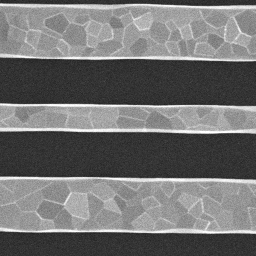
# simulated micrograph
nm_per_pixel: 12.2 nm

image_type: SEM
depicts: wiring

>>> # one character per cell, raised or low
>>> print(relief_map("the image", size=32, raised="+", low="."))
................................
++++++++++++++++++++++++++++++++
++++++++++++++++++++++++++++++++
++++++++++++++++++++++++++++++++
++++++++++++++++++++++++++++++++
++++++++++++++++++++++++++++++++
++++++++++++++++++++++++++++++++
................................
................................
................................
................................
................................
................................
++++++++++++++++++++++++++++++..
++++++++++++++++++++++++++++++++
++++++++++++++++++++++++++++++++
.........................+++....
................................
................................
................................
................................
................................
+++++++++++++++++..+++..........
++++++++++++++++++++++++++++++++
++++++++++++++++++++++++++++++++
++++++++++++++++++++++++++++++++
++++++++++++++++++++++++++++++++
++++++++++++++++++++++++++++++++
++++++++++++++++++++++++++++++++
................................
................................
................................